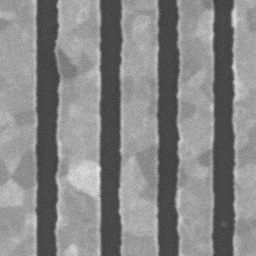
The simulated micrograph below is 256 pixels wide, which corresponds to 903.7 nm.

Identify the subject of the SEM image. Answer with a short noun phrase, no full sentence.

lines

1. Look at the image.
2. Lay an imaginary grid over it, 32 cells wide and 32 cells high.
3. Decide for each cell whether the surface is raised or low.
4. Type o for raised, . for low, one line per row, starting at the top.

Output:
oooo...ooooo...ooooo..ooooo..ooo
oooo...ooooo...ooooo..ooooo..ooo
oooo...ooooo...ooooo..ooooo..ooo
oooo...ooooo...ooooo..ooooo..ooo
oooo...ooooo...ooooo..ooooo..ooo
oooo...ooooo...ooooo..ooooo..ooo
oooo...ooooo...ooooo..ooooo..ooo
oooo...ooooo...ooooo...oooo..ooo
oooo...ooooo...ooooo...oooo..ooo
oooo...ooooo...ooooo..ooooo..ooo
oooo...ooooo...ooooo..ooooo..ooo
oooo...ooooo...ooooo..ooooo..ooo
oooo...ooooo...ooooo..ooooo..ooo
oooo...ooooo...ooooo..ooooo..ooo
ooooo..ooooo...oooo...ooooo..ooo
ooooo..ooooo...ooooo..ooooo..ooo
oooo...ooooo...ooooo..ooooo..ooo
oooo...ooooo...ooooo..ooooo..ooo
oooo...ooooo...ooooo..ooooo..ooo
oooo...ooooo...ooooo..ooooo..ooo
oooo...ooooo...ooooo..ooooo..ooo
ooooo..ooooo...ooooo..ooooo..ooo
oooo...ooooo...ooooo..ooooo..ooo
ooooo..ooooo...ooooo..ooooo..ooo
oooo...ooooo...ooooo..ooooo..ooo
oooo...ooooo...oooo...ooooo..ooo
oooo...ooooo...ooooo..ooooo..ooo
oooo...ooooo...ooooo..ooooo..ooo
oooo...ooooo...ooooo..ooooo..ooo
oooo...ooooo...ooooo..ooooo..ooo
oooo...ooooo...ooooo..ooooo..ooo
oooo...ooooo...ooooo..ooooo..ooo